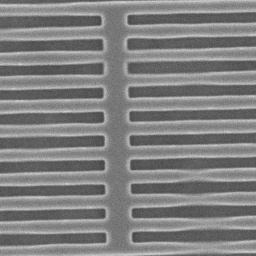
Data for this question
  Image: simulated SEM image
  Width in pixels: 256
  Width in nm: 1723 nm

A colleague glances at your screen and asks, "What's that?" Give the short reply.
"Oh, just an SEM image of groups of lines, slits or small figures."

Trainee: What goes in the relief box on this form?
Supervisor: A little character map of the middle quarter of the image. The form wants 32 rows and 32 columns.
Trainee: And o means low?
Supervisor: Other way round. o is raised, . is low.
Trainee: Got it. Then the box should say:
..........oooooo................
..........oooooo................
..........oooooo................
oooooooooooooooooooooooooooooooo
oooooooooooooooooooooooooooooooo
ooooooooooooooooo...............
..........oooooo................
..........oooooo................
..........oooooo..............oo
oooooooooooooooooooooooooooooooo
oooooooooooooooooooooooooooooooo
ooooooooooooooooo..oo...........
..........oooooo................
..........oooooo................
..........ooooooo.......oooooooo
oooooooooooooooooooooooooooooooo
oooooooooooooooooooooooooooooooo
oooooooooooooooooooooooo........
..........oooooo................
..........oooooo................
..........ooooooo...............
oooooooooooooooooooooooooooooooo
oooooooooooooooooooooooooooooooo
ooooooooooooooooooooooo.........
..........oooooo................
..........oooooo................
..........ooooooo...............
oooooooooooooooooooooooooooooooo
oooooooooooooooooooooooooooooooo
oooooooooooooooooooooooooo......
..........ooooooo...............
..........ooooooo...............